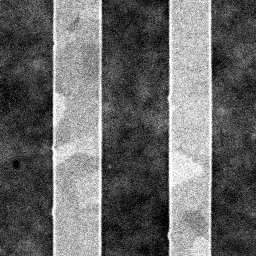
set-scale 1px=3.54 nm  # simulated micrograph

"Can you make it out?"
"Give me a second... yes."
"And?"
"one or a few lines or trenches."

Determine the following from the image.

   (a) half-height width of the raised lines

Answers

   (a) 155 nm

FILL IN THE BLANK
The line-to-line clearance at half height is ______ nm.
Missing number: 246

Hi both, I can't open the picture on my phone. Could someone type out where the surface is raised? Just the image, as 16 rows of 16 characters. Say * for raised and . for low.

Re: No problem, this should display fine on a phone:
...***.....**...
...***.....**...
...***.....**...
...***.....**...
...***.....**...
...***.....**...
...***.....**...
...***.....**...
...***.....**...
...***.....**...
...***.....**...
...***.....**...
...***.....**...
...***.....**...
...***.....**...
...***.....**...